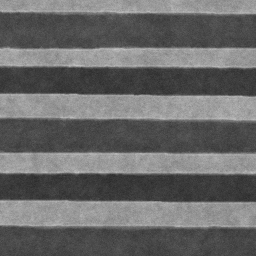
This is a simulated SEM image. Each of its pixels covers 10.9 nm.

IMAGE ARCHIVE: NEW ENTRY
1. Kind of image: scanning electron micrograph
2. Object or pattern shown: lines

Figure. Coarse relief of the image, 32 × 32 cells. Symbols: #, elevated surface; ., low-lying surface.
################################
...........##.##################
................................
................................
................................
................................
################################
################################
................................
................................
................................
................................
################################
################################
################################
................................
................................
................................
................................
################################
################################
################################
................................
................................
................................
################################
################################
################################
................................
................................
................................
................................